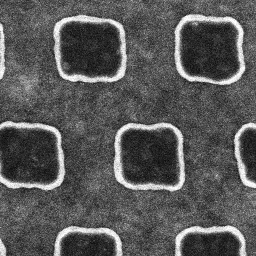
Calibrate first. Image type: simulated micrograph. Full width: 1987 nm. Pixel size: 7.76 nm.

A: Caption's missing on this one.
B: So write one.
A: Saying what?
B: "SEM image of raised bodies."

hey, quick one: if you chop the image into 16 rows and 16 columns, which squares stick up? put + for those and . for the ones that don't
................
....+++....++++.
...+++++...++++.
....++++...++++.
....++++...++++.
................
................
................
++++...++++....+
++++...++++....+
++++...++++....+
.++.....+++.....
................
................
....+++.....+++.
....++++...++++.